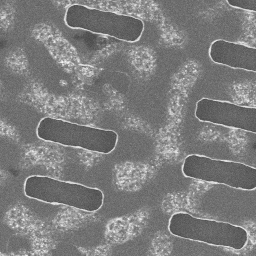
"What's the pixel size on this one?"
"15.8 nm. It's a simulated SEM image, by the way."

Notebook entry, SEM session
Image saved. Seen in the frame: holes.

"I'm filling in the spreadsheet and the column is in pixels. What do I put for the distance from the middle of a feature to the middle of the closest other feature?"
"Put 87.6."